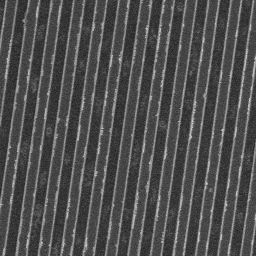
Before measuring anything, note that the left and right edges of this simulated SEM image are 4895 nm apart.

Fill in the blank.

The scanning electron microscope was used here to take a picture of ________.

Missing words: parallel lines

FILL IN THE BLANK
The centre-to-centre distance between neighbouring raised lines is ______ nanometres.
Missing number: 425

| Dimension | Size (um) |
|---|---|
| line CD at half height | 0.211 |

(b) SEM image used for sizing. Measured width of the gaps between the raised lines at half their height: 213 nm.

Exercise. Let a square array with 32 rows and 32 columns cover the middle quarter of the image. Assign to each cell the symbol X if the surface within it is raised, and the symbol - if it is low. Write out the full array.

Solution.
XXX---XX---XXX---XXX---XX---XXX-
XXX---XX---XXX---XX---XXX---XXX-
XXX---XX---XXX---XX---XXX---XXX-
XX---XXX---XXX---XX---XXX---XX--
XX---XXX---XX---XXX---XXX---XX--
XX---XXX---XX---XXX---XXX--XXX--
XX---XXX---XX---XXX---XX---XXX--
XX---XX---XXX---XXX---XX---XXX--
XX---XX---XXX---XXX--XXX---XXX--
XX---XX---XXX---XX---XXX---XXX--
X---XXX---XXX---XX---XXX---XX---
X---XXX---XXX--XXX---XXX---XX---
X---XXX---XX---XXX---XXX---XX---
X---XXX---XX---XXX---XX---XXX---
X---XX---XXX---XXX---XX---XXX---
X---XX---XXX---XXX--XXX---XXX---
X---XX---XXX---XX---XXX---XXX---
---XXX---XXX---XX---XXX---XX---X
---XXX---XXX--XXX---XXX---XX---X
---XXX---XX---XXX---XXX---XX---X
---XXX---XX---XXX---XX---XXX---X
---XXX--XXX---XXX---XX---XXX---X
---XX---XXX---XXX---XX---XXX---X
---XX---XXX---XX---XXX---XXX---X
--XXX---XXX---XX---XXX---XX---XX
--XXX---XXX---XX---XXX---XX---XX
--XXX---XX---XXX---XXX---XX---XX
--XXX---XX---XXX---XX---XXX---XX
--XXX--XXX---XXX---XX---XXX---XX
--XX---XXX---XXX---XX---XXX---XX
--XX---XXX---XX---XXX---XXX---XX
-XXX---XXX---XX---XXX---XXX---XX